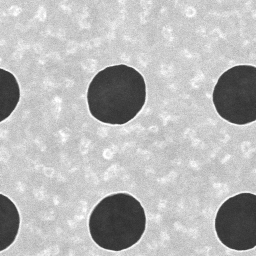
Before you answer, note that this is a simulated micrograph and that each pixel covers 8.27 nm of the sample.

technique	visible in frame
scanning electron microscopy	holes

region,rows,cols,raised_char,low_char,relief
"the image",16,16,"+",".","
++++++++++++++++
++++++++++++++++
++++++++++++++++
++++++++++++++++
.+++++...+++++..
.+++++...++++...
.++++....++++...
++++++..++++++..
++++++++++++++++
++++++++++++++++
++++++++++++++++
++++++++++++++++
.+++++...+++++..
.+++++...+++++..
.+++++...+++++..
++++++..++++++..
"